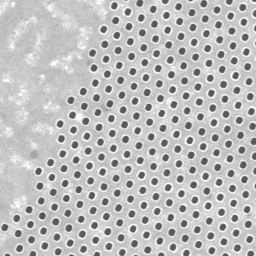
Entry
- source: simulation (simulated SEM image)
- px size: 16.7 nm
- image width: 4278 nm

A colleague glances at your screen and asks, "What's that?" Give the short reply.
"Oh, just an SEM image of a regular array of holes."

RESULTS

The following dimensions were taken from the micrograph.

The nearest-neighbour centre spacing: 244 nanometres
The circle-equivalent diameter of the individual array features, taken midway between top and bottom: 126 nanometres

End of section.